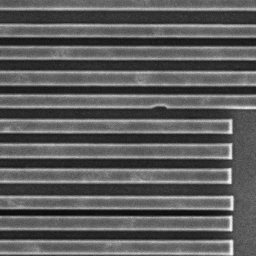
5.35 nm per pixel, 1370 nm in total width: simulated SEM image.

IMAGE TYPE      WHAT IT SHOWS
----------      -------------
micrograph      parallel lines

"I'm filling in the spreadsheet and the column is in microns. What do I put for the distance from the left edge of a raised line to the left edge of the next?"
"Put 0.128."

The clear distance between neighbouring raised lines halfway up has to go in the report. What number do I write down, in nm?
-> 56.9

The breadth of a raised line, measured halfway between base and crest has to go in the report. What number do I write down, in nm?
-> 72.9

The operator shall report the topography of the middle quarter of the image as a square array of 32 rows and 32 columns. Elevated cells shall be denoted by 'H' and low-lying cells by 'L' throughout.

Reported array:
LLLLLLLLLLLLLLLLLLLLLLLLLLLLLLLL
LLLLLLLLLLLLLLLLLLLLLLLLLLLLLLLL
HHHHHHHHHHHHHHHHHHHHHHHHHHHHHHHH
HHHHHHHHHHHHHHHHHHHHHHHHHHHHHHHH
HHHHHHHHHHHHHHHHHHHHHHHHHHHHHHHH
LLLLLLLLLLLLLLLLLLLLLLLLLLLLLLLL
LLLLLLLLLLLLLLLLLLLLLLLLLLLLLLLL
LLLLLLLLLLLLLLLLLLLLLLLLLLLLLLLL
HHHHHHHHHHHHHHHHHHHHHHHHHHHHHHHH
HHHHHHHHHHHHHHHHHHHHHHHHHHHHHHHH
HHHHHHHHHHHHHHHHHHHHHHHLLHHHHHHH
LLLLLLLLLLLLLLLLLLLLLLLLLLLLLLLL
LLLLLLLLLLLLLLLLLLLLLLLLLLLLLLLL
LLLLLLLLLLLLLLLLLLLLLLLLLLLLLLLL
HHHHHHHHHHHHHHHHHHHHHHHHHHHHHHHH
HHHHHHHHHHHHHHHHHHHHHHHHHHHHHHHH
HHHHHHHHHHHHHHHHHHHHHHHHHHHHHHHH
LLLLLLLLLLLLLLLLLLLLLLLLLLLLLLLL
LLLLLLLLLLLLLLLLLLLLLLLLLLLLLLLL
LLLLLLLLLLLLLLLLLLLLLLLLLLLLLLLL
HHHHHHHHHHHHHHHHHHHHHHHHHHHHHHHH
HHHHHHHHHHHHHHHHHHHHHHHHHHHHHHHH
HHHHHHHHHHHHHHHHHHHHHHHHHHHHHHHH
LLLLLLLLLLLLLLLLLLLLLLLLLLLLLLLL
LLLLLLLLLLLLLLLLLLLLLLLLLLLLLLLL
LLLLLLLLLLLLLLLLLLLLLLLLLLLLLLLL
HHHHHHHHHHHHHHHHHHHHHHHHHHHHHHHH
HHHHHHHHHHHHHHHHHHHHHHHHHHHHHHHH
HHHHHHHHHHHHHHHHHHHHHHHHHHHHHHHH
HHHHHHHHHHHHHHHHHHHHHHHHHHHHHHHH
LLLLLLLLLLLLLLLLLLLLLLLLLLLLLLLL
LLLLLLLLLLLLLLLLLLLLLLLLLLLLLLLL